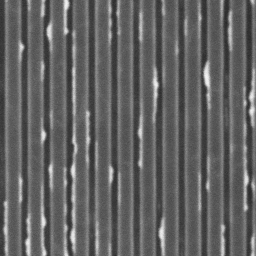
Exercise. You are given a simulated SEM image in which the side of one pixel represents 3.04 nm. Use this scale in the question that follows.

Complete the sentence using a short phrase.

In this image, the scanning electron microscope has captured parallel lines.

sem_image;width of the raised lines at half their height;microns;0.0465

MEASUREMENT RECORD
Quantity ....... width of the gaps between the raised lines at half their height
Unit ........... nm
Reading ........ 20.5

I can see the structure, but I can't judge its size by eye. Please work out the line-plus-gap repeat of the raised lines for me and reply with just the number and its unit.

68.1 nm